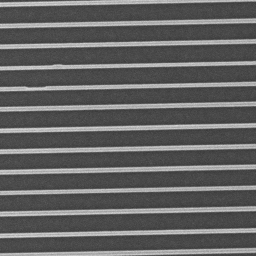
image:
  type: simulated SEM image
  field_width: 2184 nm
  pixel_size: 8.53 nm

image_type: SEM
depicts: parallel lines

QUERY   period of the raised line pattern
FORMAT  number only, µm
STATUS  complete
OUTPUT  0.179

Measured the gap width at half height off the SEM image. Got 16.9 px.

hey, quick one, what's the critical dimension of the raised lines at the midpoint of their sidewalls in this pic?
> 3.75 px